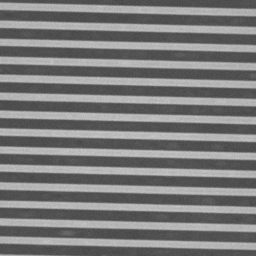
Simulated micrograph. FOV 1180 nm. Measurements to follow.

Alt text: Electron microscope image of parallel lines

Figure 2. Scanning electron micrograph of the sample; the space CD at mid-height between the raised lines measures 49.5 nm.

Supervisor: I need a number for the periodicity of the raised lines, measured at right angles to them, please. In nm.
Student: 82.9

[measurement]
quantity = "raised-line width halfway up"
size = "31.7 nanometres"